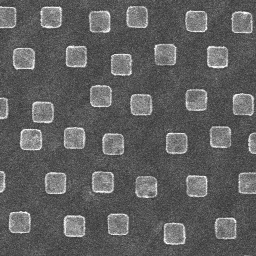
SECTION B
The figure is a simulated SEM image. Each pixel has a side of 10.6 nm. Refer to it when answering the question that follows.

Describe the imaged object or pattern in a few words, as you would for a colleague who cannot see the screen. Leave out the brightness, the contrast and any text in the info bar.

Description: a regular array of raised bodies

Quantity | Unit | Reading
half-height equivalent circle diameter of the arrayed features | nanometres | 243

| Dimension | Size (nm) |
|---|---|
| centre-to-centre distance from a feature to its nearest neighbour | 448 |